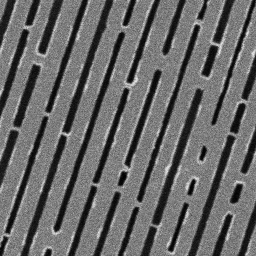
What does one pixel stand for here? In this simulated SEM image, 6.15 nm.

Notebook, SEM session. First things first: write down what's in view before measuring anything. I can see parallel lines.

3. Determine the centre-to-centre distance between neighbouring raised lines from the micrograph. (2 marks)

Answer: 141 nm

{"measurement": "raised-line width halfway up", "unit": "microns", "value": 0.104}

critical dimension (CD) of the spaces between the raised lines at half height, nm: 37.9